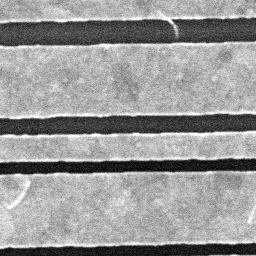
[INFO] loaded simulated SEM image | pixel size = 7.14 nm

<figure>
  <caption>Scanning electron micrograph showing lines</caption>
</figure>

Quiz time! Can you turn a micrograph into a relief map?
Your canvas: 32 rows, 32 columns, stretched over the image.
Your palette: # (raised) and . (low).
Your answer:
################################
################################
###########.....................
................................
................................
.....................###########
################################
################################
################################
################################
################################
################################
################################
################################
#######.........................
................................
..............................##
################################
################################
################################
................................
..........................######
################################
################################
################################
################################
################################
################################
################################
################################
#####################...........
................................